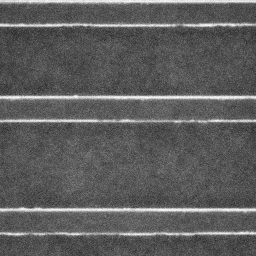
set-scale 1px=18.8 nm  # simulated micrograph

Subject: lines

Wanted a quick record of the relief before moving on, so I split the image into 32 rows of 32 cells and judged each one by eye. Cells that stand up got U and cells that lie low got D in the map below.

UUUUUUUUUUUUUUUUUUUUUUUUUUUUUUUU
UUUUUUUUUUUUUUUUUUUUUUUUUUUUUUUU
UUUUUUUUUUUUUUUUUUUUUUUUUUUUUUUU
DDDDDDDDDDDDDDDDDDDDDDDDDDDDDDDD
DDDDDDDDDDDDDDDDDDDDDDDDDDDDDDDD
DDDDDDDDDDDDDDDDDDDDDDDDDDDDDDDD
DDDDDDDDDDDDDDDDDDDDDDDDDDDDDDDD
DDDDDDDDDDDDDDDDDDDDDDDDDDDDDDDD
DDDDDDDDDDDDDDDDDDDDDDDDDDDDDDDD
DDDDDDDDDDDDDDDDDDDDDDDDDDDDDDDD
DDDDDDDDDDDDDDDDDDDDDDDDDDDDDDDD
DDDDDDDDDDDDDDDDDDDDDDDDDDDDDDDD
UUUUUUUUUUUUUUUUUUUUUUUUUUUUUUUU
UUUUUUUUUUUUUUUUUUUUUUUUUUUUUUUU
UUUUUUUUUUUUUUUUUUUUUUUUUUUUUUUU
DDDDDDDDDDDDDDDDDDDDDDDDDDDDDDDD
DDDDDDDDDDDDDDDDDDDDDDDDDDDDDDDD
DDDDDDDDDDDDDDDDDDDDDDDDDDDDDDDD
DDDDDDDDDDDDDDDDDDDDDDDDDDDDDDDD
DDDDDDDDDDDDDDDDDDDDDDDDDDDDDDDD
DDDDDDDDDDDDDDDDDDDDDDDDDDDDDDDD
DDDDDDDDDDDDDDDDDDDDDDDDDDDDDDDD
DDDDDDDDDDDDDDDDDDDDDDDDDDDDDDDD
DDDDDDDDDDDDDDDDDDDDDDDDDDDDDDDD
DDDDDDDDDDDDDDDDDDDDDDDDDDDDDDDD
DDDDDDDDDDDDDDDDDDDDDDDDDDDDDDDD
UUUUUUUUUUUUUUUUUUUUUUUUUUUUUUUU
UUUUUUUUUUUUUUUUUUUUUUUUUUUUUUUU
UUUUUUUUUUUUUUUUUUUUUUUUUUUUUUUU
DDDDDDDDDDDDDDDDDDDDDDDDDDDDDDDD
DDDDDDDDDDDDDDDDDDDDDDDDDDDDDDDD
DDDDDDDDDDDDDDDDDDDDDDDDDDDDDDDD